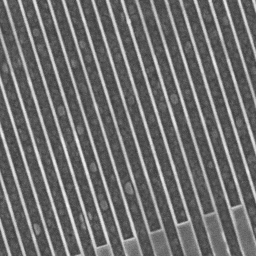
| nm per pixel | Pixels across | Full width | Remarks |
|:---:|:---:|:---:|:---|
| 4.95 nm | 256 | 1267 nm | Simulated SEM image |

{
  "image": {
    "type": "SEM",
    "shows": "parallel lines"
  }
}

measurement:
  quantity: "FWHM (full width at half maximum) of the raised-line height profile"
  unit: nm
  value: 11.2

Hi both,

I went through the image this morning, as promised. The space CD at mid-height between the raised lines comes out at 58.5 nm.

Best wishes